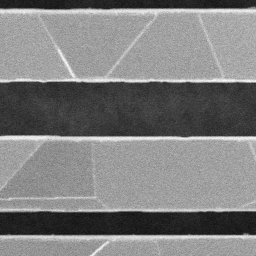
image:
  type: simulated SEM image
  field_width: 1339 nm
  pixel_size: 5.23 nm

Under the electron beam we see lines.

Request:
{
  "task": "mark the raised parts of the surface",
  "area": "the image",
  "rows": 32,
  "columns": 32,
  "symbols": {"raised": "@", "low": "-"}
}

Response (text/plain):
--------------------------------
@@@@@@@@@@@@@@@@@@@@@@@@@@@@@@@@
@@@@@@@@@@@@@@@@@@@@@@@@@@@@@@@@
@@@@@@@@@@@@@@@@@@@@@@@@@@@@@@@@
@@@@@@@@@@@@@@@@@@@@@@@@@@@@@@@@
@@@@@@@@@@@@@@@@@@@@@@@@@@@@@@@@
@@@@@@@@@@@@@@@@@@@@@@@@@@@@@@@@
@@@@@@@@@@@@@@@@@@@@@@@@@@@@@@@@
@@@@@@@@@@@@@@@@@@@@@@@@@@@@@@@@
@@@@@@@@@@@@@@@@@@@@@@@@@@@@@@@@
--------------------------------
--------------------------------
--------------------------------
--------------------------------
--------------------------------
--------------------------------
--------------------------------
@@@@@@@@@@@@@@@@@@@@@@@@@@@@@@@@
@@@@@@@@@@@@@@@@@@@@@@@@@@@@@@@@
@@@@@@@@@@@@@@@@@@@@@@@@@@@@@@@@
@@@@@@@@@@@@@@@@@@@@@@@@@@@@@@@@
@@@@@@@@@@@@@@@@@@@@@@@@@@@@@@@@
@@@@@@@@@@@@@@@@@@@@@@@@@@@@@@@@
@@@@@@@@@@@@@@@@@@@@@@@@@@@@@@@@
@@@@@@@@@@@@@@@@@@@@@@@@@@@@@@@@
@@@@@@@@@@@@@@@@@@@@@@@@@@@@@@@@
--------------------------------
--------------------------------
--------------------------------
@@@@@@@@@@@@@@@@@@@@@@@@@@@@@@@@
@@@@@@@@@@@@@@@@@@@@@@@@@@@@@@@@
@@@@@@@@@@@@@@@@@@@@@@@@@@@@@@@@